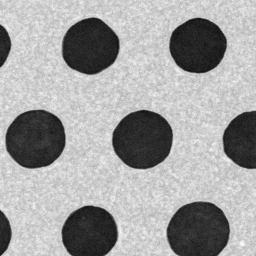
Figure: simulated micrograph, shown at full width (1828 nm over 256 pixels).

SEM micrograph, holes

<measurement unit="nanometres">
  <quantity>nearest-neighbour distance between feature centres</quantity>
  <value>764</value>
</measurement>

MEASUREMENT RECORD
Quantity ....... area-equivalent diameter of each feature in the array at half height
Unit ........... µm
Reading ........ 0.416